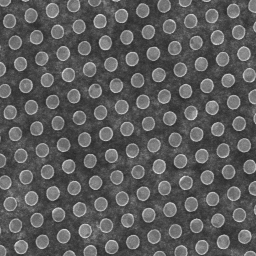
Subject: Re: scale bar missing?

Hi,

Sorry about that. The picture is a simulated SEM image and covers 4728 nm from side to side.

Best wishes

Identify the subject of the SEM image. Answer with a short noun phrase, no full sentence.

a regular array of raised bodies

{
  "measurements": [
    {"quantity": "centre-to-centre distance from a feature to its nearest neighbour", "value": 403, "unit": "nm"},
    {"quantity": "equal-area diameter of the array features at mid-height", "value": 245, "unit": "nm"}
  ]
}